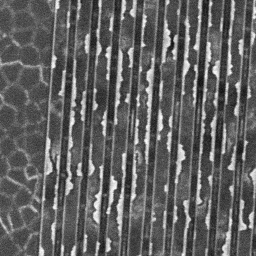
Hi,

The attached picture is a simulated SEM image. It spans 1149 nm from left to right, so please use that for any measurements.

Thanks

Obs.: parallel lines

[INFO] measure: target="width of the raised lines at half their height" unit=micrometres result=0.0655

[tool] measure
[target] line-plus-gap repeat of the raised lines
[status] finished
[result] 98.3 nanometres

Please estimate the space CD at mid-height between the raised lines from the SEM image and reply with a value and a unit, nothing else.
35.3 nm